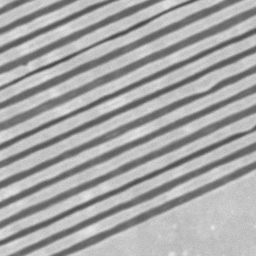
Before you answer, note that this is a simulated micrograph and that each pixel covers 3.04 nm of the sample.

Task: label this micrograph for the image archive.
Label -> parallel lines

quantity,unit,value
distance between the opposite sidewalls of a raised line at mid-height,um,0.033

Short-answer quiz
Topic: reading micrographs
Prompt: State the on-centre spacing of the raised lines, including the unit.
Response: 53.5 nm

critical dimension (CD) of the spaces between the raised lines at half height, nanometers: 20.4